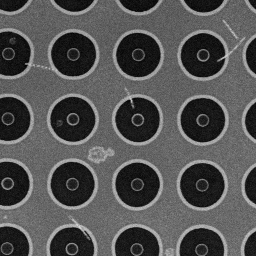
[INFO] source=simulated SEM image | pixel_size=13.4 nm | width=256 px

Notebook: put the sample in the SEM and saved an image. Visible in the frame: an array of small figures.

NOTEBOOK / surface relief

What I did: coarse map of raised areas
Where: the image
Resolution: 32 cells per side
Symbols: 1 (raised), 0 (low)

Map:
00011110000011100000111000001110
00111111001111110011111100011111
11111111111111111111111111111111
11111111111111111111111111111111
00011110000111100001111100011111
00001100000011100000111000001110
00001100000011000000110000001110
00001100000011000000110000001110
00011110000011100000111000001110
00111111001111110001111100011111
11111111111111111111111111111111
11111111111111111111111111111111
00011110000111110001111100011111
00001100000011100000111000001110
00001100000011000000110000001110
00001100000011000000110000001100
00001110000011100000111000001110
00111111000111110001111100011111
11111111111111111111111111111111
11111111111111111111111111111111
00011110000111110001111100011111
00001110000011100000111000001110
00001100000011000000110000001100
00001100000011000000110000001100
00011110000011100000111000001110
00111110000111100001111000011111
11111111111111111111111111111111
11111111111111111111111111111111
00111111001111110011111100111111
00011110000111100000111000001110
00001100000011000000110000001100
00001100000011000000110000001100